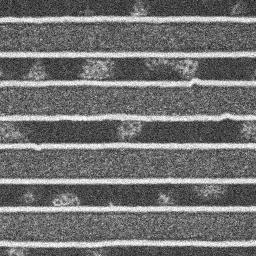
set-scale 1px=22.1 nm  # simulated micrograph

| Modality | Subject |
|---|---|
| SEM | one or a few lines or trenches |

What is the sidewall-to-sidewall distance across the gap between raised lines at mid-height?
768 nm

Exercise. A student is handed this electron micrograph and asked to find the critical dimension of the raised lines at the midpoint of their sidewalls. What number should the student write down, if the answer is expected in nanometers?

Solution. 627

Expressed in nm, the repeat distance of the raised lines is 1390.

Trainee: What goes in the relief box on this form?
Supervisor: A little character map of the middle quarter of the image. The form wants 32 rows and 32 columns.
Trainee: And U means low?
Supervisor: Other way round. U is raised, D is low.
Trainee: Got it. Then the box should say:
UUUUUUUUUUUUUUUUUUUUUUUUUUUUUUUU
UUUUUUUUUUUUUUUUUUUUUUUUUUUUUUUU
UUUUUUUUUUUUUUUUUUUUUUUUUUUUUUUU
UUUUUUUUUUUUUUUUUUUUUUUUUUUUUUUU
UUUUUUUUUUUUUUUUUUUUUUUUUUUUUUUU
DDDDDDDDDDDDDDDDDDDDDDDDDDDDDDDD
DDDDDDDDDDDDDDDDDDDDDDDDDDDDDDDD
DDDDDDDDDDDDDDDDDDDDDDDDDDDDDDDD
DDDDDDDDDDDDDDDDDDDDDDDDDDDDDDDD
DDDDDDDDDDDDDDDDDDDDDDDDDDDDDDDD
DDDDDDDDDDDDDDDDDDDDDDDDDDDDDDDD
DDDDDDDDDDDDDDDDDDDDDDDDDDDDDDDD
DDDDDDDDDDDDDDDDDDDDDDDDDDDDDDDD
DDDDDDDDDUUUUUUUDDDDDDDDDDDDDDDD
UUUUUUUUUUUUUUUUUUUUUUUUUUUUUUUU
UUUUUUUUUUUUUUUUUUUUUUUUUUUUUUUU
UUUUUUUUUUUUUUUUUUUUUUUUUUUUUUUU
UUUUUUUUUUUUUUUUUUUUUUUUUUUUUUUU
UUUUUUUUUUUUUUUUUUUUUUUUUUUUUUUU
UUUUUUUUUUUUUUUUUUUUUUUUUUUUUUUU
DDDDDDDDDDDDDDDDDDDDDDDDDDDDDDDD
DDDDDDDDDDDDDDDDDDDDDDDDDDDDDDDD
DDDDDDDDDDDDDDDDDDDDDDDDDDDDDDDD
DDDDDDDDDDDDDDDDDDDDDDDDDDDDDDDD
DDDDDDDDDDDDDDDDDDDDDDDDDDDDDDDD
DDDDDDDDDDDDDDDDDDDDDDDDDDDDDDDD
DDDDDDDDDDDDDDDDDDDDDDDDDDDDDDDD
DDDDDDDDDDDDDDDDDDDDDDDDDDDDDDDD
DDDDDDDDDDDDDDDDDDDDDDDDDDDDDDDD
UDDDUDDDDUUUUUUDDDUUUUUUUUUUUUUU
UUUUUUUUUUUUUUUUUUUUUUUUUUUUUUUU
UUUUUUUUUUUUUUUUUUUUUUUUUUUUUUUU